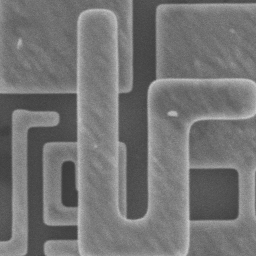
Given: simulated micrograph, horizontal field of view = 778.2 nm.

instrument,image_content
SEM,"wiring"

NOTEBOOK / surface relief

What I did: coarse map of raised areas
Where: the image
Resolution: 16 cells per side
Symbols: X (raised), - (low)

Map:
----------------
-----XX---------
-----XX---------
-----XX---------
-----XX---------
-----XX--XXXXXXX
-----XX--XXXXXXX
-----XX--XXXX---
-----XX--XXX----
-----XX--XXX----
-----XX--XXX----
-----XX--XXX----
-----XX--XXX----
-----XXX-XXX----
-----XXXXXXX----
-----XXXXXXX----